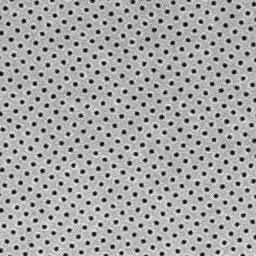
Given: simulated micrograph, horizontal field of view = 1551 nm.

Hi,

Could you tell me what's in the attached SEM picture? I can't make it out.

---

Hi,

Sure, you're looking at a regular array of holes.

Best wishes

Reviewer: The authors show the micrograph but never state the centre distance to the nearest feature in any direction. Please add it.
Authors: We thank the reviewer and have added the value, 0.0663 microns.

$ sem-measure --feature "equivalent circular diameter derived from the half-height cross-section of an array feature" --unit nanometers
31.3